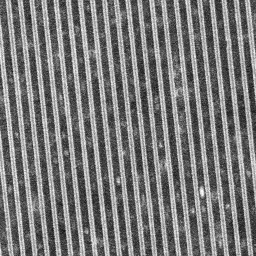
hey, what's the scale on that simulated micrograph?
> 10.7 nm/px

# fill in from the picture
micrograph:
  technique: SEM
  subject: parallel lines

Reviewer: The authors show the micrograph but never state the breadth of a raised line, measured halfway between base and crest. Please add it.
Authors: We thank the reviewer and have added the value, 0.0372 micrometres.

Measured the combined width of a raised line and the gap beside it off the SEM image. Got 128 nm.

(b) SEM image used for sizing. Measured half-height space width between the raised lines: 93.2 nm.